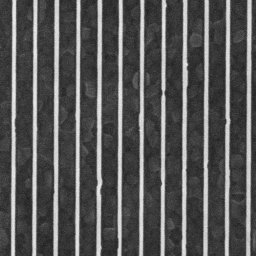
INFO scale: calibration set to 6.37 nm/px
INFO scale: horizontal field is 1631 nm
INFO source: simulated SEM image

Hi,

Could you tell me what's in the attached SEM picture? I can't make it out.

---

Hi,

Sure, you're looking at parallel lines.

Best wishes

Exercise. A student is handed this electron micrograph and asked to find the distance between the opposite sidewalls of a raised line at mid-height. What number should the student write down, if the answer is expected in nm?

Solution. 22.3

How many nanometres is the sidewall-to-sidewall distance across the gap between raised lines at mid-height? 112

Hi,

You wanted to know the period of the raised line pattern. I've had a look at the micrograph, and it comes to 136 nm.